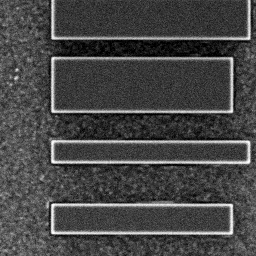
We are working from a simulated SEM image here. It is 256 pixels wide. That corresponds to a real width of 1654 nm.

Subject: groups of lines, slits or small figures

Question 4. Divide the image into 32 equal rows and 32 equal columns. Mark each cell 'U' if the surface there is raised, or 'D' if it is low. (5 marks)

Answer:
DDDDDDDUUUUUUUUUUUUUUUUUUUUUUUUD
DDDDDDDUUUUUUUUUUUUUUUUUUUUUUUUD
DDDDDDDUUUUUUUUUUUUUUUUUUUUUUUUD
DDDDDDDUUUUUUUUUUUUUUUUUUUUUUUUD
DDDDDDDUUUUUUUUUUUUUUUUUUUUUUUUD
DDDDDDDDDDDDDDDDDDDDDDDDDDDDDDDD
DDDDDDDDDDDDDDDDDDDDDDDDDDDDDDDD
DDDDDDDUUUUUUUUUUUUUUUUUUUUUUDDD
DDDDDDDUUUUUUUUUUUUUUUUUUUUUUDDD
DDDDDDDUUUUUUUUUUUUUUUUUUUUUUDDD
DDDDDDDUUUUUUUUUUUUUUUUUUUUUUDDD
DDDDDDDUUUUUUUUUUUUUUUUUUUUUUDDD
DDDDDDDUUUUUUUUUUUUUUUUUUUUUUDDD
DDDDDDDUUUUUUUUUUUUUUUUUUUUUUDDD
DDDDDDDDDDDDDDDDDDDDDDDDDDDDDDDD
DDDDDDDDDDDDDDDDDDDDDDDDDDDDDDDD
DDDDDDDDDDDDDDDDDDDDDDDDDDDDDDDD
DDDDDDDDDDDDDDDDDDDDDDDDDDDDDDDD
DDDDDDDUUUUUUUUUUUUUUUUUUUUUUUUD
DDDDDDDUUUUUUUUUUUUUUUUUUUUUUUUD
DDDDDDDDDDDDDDDDDDDDDDDDDDDDDDDD
DDDDDDDDDDDDDDDDDDDDDDDDDDDDDDDD
DDDDDDDDDDDDDDDDDDDDDDDDDDDDDDDD
DDDDDDDDDDDDDDDDDDDDDDDDDDDDDDDD
DDDDDDDDDDDDDDDDDDDDDDDDDDDDDDDD
DDDDDDDDDDDDDDDDDDDDDDDDDDDDDDDD
DDDDDDDUUUUUUUUUUUUUUUUUUUUUUDDD
DDDDDDDUUUUUUUUUUUUUUUUUUUUUUDDD
DDDDDDDUUUUUUUUUUUUUUUUUUUUUUDDD
DDDDDDDDDDDDDDDDDDDDDDDDDDDDDDDD
DDDDDDDDDDDDDDDDDDDDDDDDDDDDDDDD
DDDDDDDDDDDDDDDDDDDDDDDDDDDDDDDD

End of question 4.